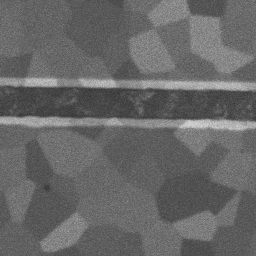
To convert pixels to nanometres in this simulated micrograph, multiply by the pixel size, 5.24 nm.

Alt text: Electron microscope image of one or a few lines or trenches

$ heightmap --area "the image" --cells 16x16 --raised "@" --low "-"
@@@@@@@@@@@@@@@@
@@@@@@@@@@@@@@@@
@@@@@@@@@@@@@@@@
@@@@@@@@@@@@@@@@
@@@@@@@@@@@@@@@@
----------------
----------------
@---------------
@@@@@@@@@@@@@@@@
@@@@@@@@@@@@@@@@
@@@@@@@@@@@@@@@@
@@@@@@@@@@@@@@@@
@@@@@@@@@@@@@@@@
@@@@@@@@@@@@@@@@
@@@@@@@@@@@@@@@@
@@@@@@@@@@@@@@@@